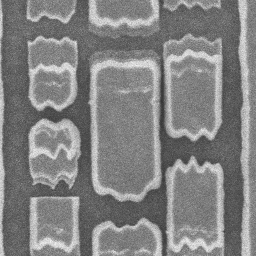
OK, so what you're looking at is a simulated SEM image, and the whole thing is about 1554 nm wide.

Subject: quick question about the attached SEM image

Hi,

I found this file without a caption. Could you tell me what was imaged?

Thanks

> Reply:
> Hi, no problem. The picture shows one or a few lines or trenches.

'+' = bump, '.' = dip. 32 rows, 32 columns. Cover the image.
...........+++++++++..........++
...........+++++++++..........++
............+++++++...........++
..............................++
..............................++
..............................++
.......................+......++
.....................++++++...++
.....++.+...+++++++..++++++...++
....+++++...++++++++.++++++....+
....+++++...++++++++.++++++....+
....+++++...++++++++.++++++....+
....+++++..+++++++++.++++++....+
.......+...+++++++++.++++++....+
............++++++++.++++++....+
.....++.+...++++++++.++++++....+
....+++++...++++++++.++++++....+
....++++++..++++++++...........+
....++++++..++++++++...........+
......+.....++++++++...........+
............++++++++..+........+
............++++++++.+++++++...+
............++++++++.+++++++...+
............+++++++..+++++++...+
..............++++...+++++++...+
....+++++............+++++++...+
....+++++............+++++++...+
....+++++............+++++++...+
....+++++...+++++++..+++++++..++
....++++++..++++++++.+++++++..++
....+++++...++++++++.++.++++...+
............++++++++...........+